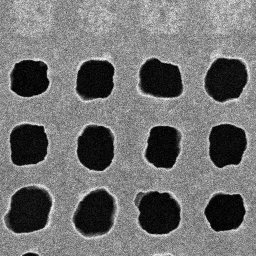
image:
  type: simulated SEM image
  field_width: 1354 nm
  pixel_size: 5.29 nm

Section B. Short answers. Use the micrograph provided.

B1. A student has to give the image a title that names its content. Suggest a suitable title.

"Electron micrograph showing a regular array of holes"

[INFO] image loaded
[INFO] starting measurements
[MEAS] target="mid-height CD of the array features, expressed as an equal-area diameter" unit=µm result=0.221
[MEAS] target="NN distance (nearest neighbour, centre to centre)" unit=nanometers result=344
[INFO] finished